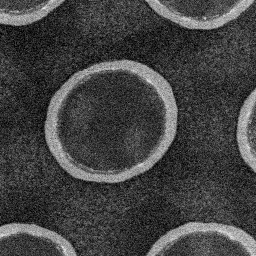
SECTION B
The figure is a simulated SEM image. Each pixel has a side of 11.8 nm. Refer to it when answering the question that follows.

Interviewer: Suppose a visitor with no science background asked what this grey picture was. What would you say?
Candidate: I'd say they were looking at raised bodies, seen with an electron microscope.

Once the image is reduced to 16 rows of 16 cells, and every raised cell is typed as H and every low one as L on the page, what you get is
HHHLLLLLLLHHHHHL
LLLLLLLLLLLLHLLL
LLLLLLLLLLLLLLLL
LLLLLLLLLLLLLLLL
LLLLLHHHHLLLLLLL
LLLLHHHHHHLLLLLL
LLLHHHHHHHHLLLLL
LLLHHHHHHHHLLLLH
LLLHHHHHHHHLLLLH
LLLLHHHHHHLLLLLH
LLLLHHHHHLLLLLLL
LLLLLLLLLLLLLLLL
LLLLLLLLLLLLLLLL
LLLLLLLLLLLLLLLL
HHHLLLLLLLLHHHHL
HHHHLLLLLLHHHHHH